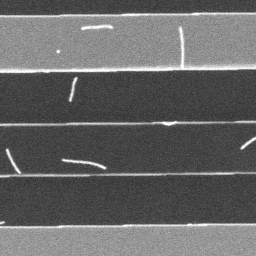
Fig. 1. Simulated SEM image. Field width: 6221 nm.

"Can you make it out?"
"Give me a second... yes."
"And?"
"lines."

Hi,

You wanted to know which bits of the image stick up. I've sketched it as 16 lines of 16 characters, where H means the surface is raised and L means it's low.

LLLLLLLLLLLLLLLL
HHHHHHHHHHHHHHHH
HHHHHHHHHHHHHHHH
HHHHHHHHHHHHHHHH
LLLLLLLLLLLLLLLL
LLLLLLLLLLLLLLLL
LLLLLLLLLLLLLLLL
LLLLLLLLLLLLLLLL
HHHHHHHHHHHHHHHH
HHHHHHHHHHHHHHHH
HHHHHHHHHHHHHHHH
LLLLLLLLLLLLLLLL
LLLLLLLLLLLLLLLL
LLLLLLLLLLLLLLLL
HHHHHHHHHHHHHHHH
HHHHHHHHHHHHHHHH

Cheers